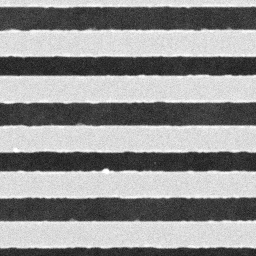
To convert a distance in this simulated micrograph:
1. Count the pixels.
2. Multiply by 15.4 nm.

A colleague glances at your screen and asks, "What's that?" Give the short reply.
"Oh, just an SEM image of lines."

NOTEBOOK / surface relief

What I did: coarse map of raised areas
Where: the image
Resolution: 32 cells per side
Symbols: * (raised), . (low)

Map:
********************************
................................
................................
................................
********************************
********************************
********************************
................................
................................
.............*.*.***...****.*.**
********************************
********************************
********************************
................................
................................
................................
********************************
********************************
********************************
................................
................................
..*.*....************..*..**.**.
********************************
********************************
********************************
................................
................................
................................
********************************
********************************
********************************
................................